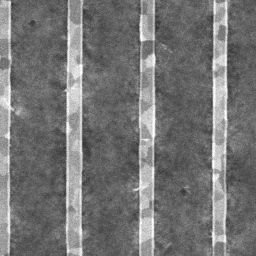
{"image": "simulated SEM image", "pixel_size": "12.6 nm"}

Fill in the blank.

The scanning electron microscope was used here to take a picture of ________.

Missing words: one or a few lines or trenches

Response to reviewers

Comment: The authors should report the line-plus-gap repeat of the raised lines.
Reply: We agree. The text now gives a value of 916 nanometers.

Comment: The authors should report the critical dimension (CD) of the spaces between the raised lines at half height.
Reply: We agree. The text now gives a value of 0.747 micrometres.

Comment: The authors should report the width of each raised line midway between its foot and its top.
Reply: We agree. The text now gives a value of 161 nanometres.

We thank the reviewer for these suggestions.